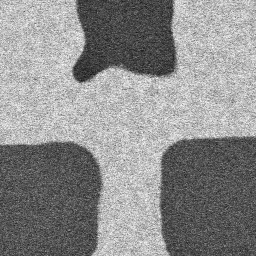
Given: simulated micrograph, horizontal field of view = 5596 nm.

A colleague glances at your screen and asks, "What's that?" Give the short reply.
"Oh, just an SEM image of holes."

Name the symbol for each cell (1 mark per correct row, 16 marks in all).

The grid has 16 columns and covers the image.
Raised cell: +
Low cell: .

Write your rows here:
+++++......+++++
+++++......+++++
+++++......+++++
+++++......+++++
+++++.++...+++++
++++++++++++++++
++++++++++++++++
++++++++++++++++
++++++++++++++++
......++++......
......++++......
......++++......
......++++......
......++++......
......++++......
......++++......